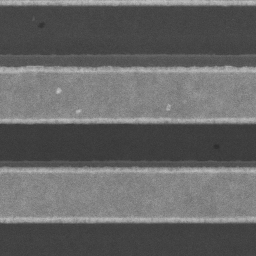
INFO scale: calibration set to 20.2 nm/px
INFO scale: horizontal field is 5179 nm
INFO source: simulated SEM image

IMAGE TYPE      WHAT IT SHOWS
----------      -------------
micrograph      lines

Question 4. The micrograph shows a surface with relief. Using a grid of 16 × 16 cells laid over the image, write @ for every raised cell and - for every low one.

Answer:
----------------
----------------
----------------
----------------
@@@@@@@@@@@@@@@@
@@@@@@@@@@@@@@@@
@@@@@@@@@@@@@@@@
@@@@@@@@@@@@@@@@
----------------
----------------
@@@@@@@@@@@@@@@@
@@@@@@@@@@@@@@@@
@@@@@@@@@@@@@@@@
@@@@@@@@@@@@@@@@
----------------
----------------